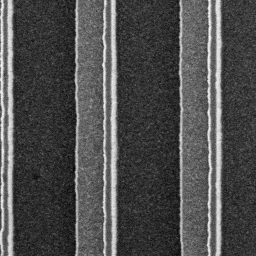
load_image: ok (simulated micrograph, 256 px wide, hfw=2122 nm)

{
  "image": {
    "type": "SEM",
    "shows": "lines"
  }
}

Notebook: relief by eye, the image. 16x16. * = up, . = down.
*....**....***..
*....**....***..
*....**....***..
*....**....***..
*....**....***..
*....**....***..
*....**....***..
*....**....***..
*....**....***..
*....**....***..
*....**....***..
*....**....***..
*....**....***..
*....**....***..
*....**....***..
*....**....***..